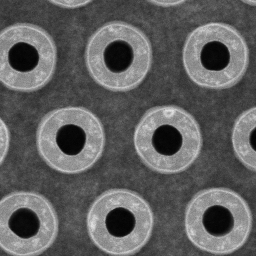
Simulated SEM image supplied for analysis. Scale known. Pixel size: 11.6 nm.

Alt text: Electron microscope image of ring-shaped raised bodies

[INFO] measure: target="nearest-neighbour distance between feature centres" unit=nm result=1110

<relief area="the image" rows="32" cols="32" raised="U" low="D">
DDDDDDDUUUDDDDDDDDDDUUDDDDDDDDDD
DDDDDDDDDDDDDDDDDDDDDDDDDDDDDDDD
DDDDDDDDDDDDDDDDDDDDDDDDDDDDDDDD
DUUUDDDDDDDDDUUUUDDDDDDDDUUUUDDD
UUUUUUDDDDDDUUUUUUDDDDDDUUUUUUDD
UUDUUUUDDDDUUUDDUUUDDDDUUUDDUUUD
UDDDDUUDDDDUUDDDDUUDDDDUUDDDDUUD
UDDDDUUDDDDUUDDDUUUDDDDUUDDDDUUD
UUDDUUUDDDDUUUDDUUUDDDDUUUDDUUUD
UUUUUUDDDDDDUUUUUUDDDDDDUUUUUUDD
DUUUUDDDDDDDDUUUUDDDDDDDDUUUUDDD
DDDDDDDDDDDDDDDDDDDDDDDDDDDDDDDD
DDDDDDDDDDDDDDDDDDDDDDDDDDDDDDDD
DDDDDDDDDDDDDDDDDDDDUUDDDDDDDDDD
DDDDDDUUUUUUDDDDDDUUUUUUDDDDDDUU
UDDDDUUUUUUUUDDDDUUUUUUUUDDDDUUU
UDDDDUUDDDDUUDDDDUUDDDUUUDDDDUUU
UDDDDUUDDDDUUDDDDUUDDDDUUDDDDUUD
UDDDDUUUDDUUUDDDDUUDDDUUUDDDDUUU
UDDDDUUUUUUUDDDDDDUUUUUUUDDDDDUU
DDDDDDUUUUUUDDDDDDDUUUUUDDDDDDDU
DDDDDDDDDDDDDDDDDDDDUUDDDDDDDDDD
DDDDDDDDDDDDDDDDDDDDDDDDDDDDDDDD
DDDDDDDDDDDDDDDDDDDDDDDDDDDDDDDD
DUUUUDDDDDDDDUUUUDDDDDDDDUUUUUDD
UUUUUUDDDDDDUUUUUUDDDDDDUUUUUUUD
UUDDUUUDDDDUUUDDUUUDDDDUUUDDDUUD
UDDDDUUDDDDUUDDDDUUDDDDUUDDDDUUD
UDDDDUUDDDDUUDDDDUUDDDDUUUDDDUUD
UUDDUUUDDDDUUUDUUUUDDDDUUUUUUUUD
UUUUUUDDDDDDUUUUUUDDDDDDUUUUUUDD
DUUUUDDDDDDDDUUUUDDDDDDDDDUUUDDD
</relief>